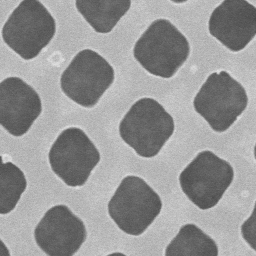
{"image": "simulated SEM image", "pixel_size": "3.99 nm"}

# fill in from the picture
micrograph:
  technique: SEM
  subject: holes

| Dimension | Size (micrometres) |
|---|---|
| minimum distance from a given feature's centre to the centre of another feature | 0.309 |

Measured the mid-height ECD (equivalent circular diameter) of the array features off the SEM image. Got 0.21 um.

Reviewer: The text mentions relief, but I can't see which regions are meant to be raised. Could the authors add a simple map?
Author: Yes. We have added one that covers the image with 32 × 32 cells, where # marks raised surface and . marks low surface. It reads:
##...####.......############...#
##....####......###########.....
#......####....#####.#####......
.......#####..####....####......
.......###########.....####.....
#.....###########......#####...#
##...#####..#####.......########
#########....####......#########
########......####....##########
########......######.#####...###
...#####......###########.....##
....####.....############......#
.....####...#####..#####.......#
.....###########....####.......#
.....###########.....####.....##
....###########.......####...###
#..#####..#####.......##########
#######....####......###########
######......#####...############
######......######.######..#####
..####......############.....###
...####....############......###
...#####...####...####.......###
...############....####.....####
...###########......###.....####
..############......####...#####
.#####...#####......############
#####.....####.....############.
####.......####...#####..#####..
####.......###########....####..
#####.....###########......####.
.#####...############......#####